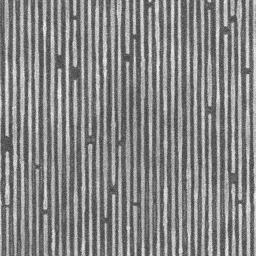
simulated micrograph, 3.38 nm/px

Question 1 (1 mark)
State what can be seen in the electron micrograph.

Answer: parallel lines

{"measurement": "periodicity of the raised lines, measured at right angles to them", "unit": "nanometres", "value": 25.5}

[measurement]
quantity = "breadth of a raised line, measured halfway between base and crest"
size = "11.4 nm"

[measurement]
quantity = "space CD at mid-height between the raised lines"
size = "14.8 nm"